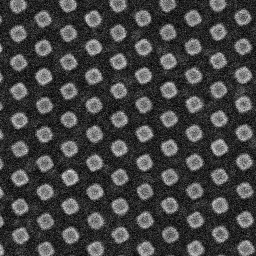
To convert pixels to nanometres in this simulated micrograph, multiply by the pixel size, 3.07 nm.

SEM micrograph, a regular array of raised bodies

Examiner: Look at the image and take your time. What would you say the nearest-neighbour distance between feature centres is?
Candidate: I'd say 87.7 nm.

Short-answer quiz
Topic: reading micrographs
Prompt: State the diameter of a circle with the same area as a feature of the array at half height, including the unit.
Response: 0.0436 µm